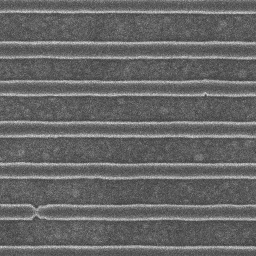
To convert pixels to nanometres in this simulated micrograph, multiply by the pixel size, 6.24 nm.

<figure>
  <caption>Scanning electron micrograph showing parallel lines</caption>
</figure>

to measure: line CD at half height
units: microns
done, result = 0.0905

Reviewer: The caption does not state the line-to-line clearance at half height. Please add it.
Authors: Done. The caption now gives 0.169 microns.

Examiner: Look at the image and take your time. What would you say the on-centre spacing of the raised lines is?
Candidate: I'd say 253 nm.